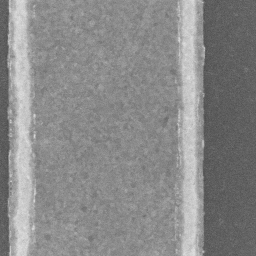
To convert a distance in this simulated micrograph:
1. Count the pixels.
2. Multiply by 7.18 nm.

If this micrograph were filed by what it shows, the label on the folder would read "one or a few lines or trenches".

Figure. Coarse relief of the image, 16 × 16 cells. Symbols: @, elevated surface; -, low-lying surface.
-@@@@@@@@@@@----
-@@@@@@@@@@@----
-@@@@@@@@@@@----
-@@@@@@@@@@@----
-@@@@@@@@@@@----
-@@@@@@@@@@@----
-@@@@@@@@@@@----
-@@@@@@@@@@@----
-@@@@@@@@@@@----
-@@@@@@@@@@@----
-@@@@@@@@@@@----
-@@@@@@@@@@@----
-@@@@@@@@@@@----
-@@@@@@@@@@@----
-@@@@@@@@@@@----
-@@@@@@@@@@@----